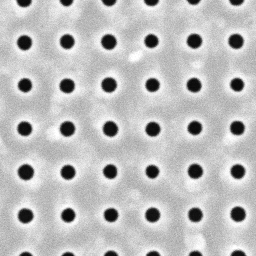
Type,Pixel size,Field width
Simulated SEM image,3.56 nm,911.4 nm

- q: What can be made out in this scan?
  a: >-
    a regular array of holes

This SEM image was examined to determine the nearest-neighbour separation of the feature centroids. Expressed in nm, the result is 150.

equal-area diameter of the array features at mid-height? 55.7 nm